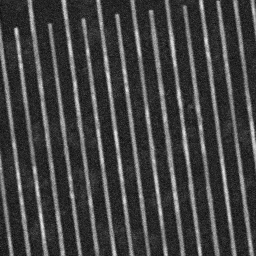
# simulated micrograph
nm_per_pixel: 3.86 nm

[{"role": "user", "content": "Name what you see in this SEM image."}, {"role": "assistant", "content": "parallel lines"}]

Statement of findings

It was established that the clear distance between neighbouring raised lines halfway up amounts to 13.9 pixels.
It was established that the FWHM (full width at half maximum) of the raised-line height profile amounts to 2.85 pixels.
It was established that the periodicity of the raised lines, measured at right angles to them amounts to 65.7 nm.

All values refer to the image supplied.